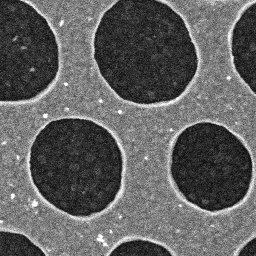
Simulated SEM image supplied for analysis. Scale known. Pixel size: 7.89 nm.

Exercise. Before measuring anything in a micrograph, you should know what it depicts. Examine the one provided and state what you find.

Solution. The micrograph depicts holes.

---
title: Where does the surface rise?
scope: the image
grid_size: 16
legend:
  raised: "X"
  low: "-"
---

--XXXXX----XXXX-
---XXX------XXX-
----XX------XX--
----XX------XXX-
----XX------XXX-
---XXXX-----XXXX
XXXXXXXXXXXXXXXX
XXXX--XXXXXXXXXX
XX-----XXXX----X
XX------XXX-----
XX------XXX-----
XX------XXX-----
XXX----XXXXX---X
XXXXX-XXXXXXXXXX
-XXXXXXXXXXXXXXX
--XXXXX---XXXXX-